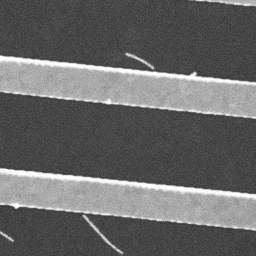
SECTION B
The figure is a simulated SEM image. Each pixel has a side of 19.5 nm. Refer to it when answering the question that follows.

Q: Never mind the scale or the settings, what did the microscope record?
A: lines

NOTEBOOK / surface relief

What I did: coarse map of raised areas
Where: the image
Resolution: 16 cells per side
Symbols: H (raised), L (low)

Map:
LLLLLLLLLLLLLLLL
LLLLLLLLLLLLLLLL
LLLLLLLLLLLLLLLL
LLLLLLLLLLLLLLLL
HHHHHHHHHLLLLLLL
HHHHHHHHHHHHHHHH
LLLLLLLHHHHHHHHH
LLLLLLLLLLLLLLLL
LLLLLLLLLLLLLLLL
LLLLLLLLLLLLLLLL
LLLLLLLLLLLLLLLL
HHHHHHHHHLLLLLLL
HHHHHHHHHHHHHHHH
LLLLLLLHHHHHHHHH
LLLLLLLLLLLLLLLL
LLLLLLLLLLLLLLLL